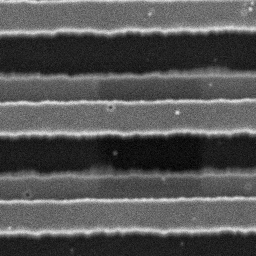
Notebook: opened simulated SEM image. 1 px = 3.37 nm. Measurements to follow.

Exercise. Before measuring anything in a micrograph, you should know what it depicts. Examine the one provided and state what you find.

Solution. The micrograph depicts lines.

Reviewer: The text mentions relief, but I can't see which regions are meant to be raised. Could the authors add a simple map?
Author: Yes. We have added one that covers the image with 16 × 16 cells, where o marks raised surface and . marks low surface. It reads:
oooooooooooooooo
oooooooooooooooo
................
................
................
oooooooooooooooo
oooooooooooooooo
oooooooooooooooo
................
................
................
oooooooooooooooo
oooooooooooooooo
oooooooooooooooo
oooooo....o.....
................